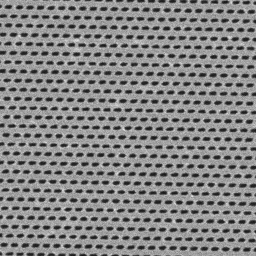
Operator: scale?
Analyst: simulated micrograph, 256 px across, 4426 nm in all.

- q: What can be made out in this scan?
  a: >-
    a regular array of holes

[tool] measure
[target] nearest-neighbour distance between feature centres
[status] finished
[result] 175 nm